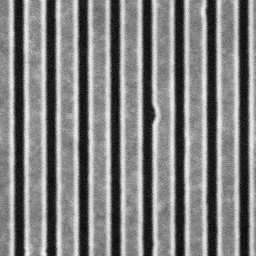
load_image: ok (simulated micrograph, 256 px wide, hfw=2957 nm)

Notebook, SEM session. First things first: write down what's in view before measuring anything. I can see parallel lines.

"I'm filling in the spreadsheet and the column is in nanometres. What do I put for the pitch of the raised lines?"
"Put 371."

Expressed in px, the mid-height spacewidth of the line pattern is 13.6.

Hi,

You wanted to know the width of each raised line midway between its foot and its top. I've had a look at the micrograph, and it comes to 0.214 um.